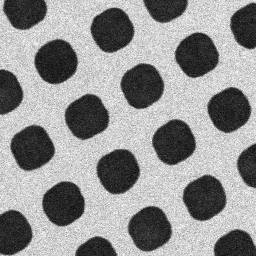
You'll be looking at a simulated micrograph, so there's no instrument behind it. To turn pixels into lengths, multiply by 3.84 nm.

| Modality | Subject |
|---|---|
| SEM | a regular array of holes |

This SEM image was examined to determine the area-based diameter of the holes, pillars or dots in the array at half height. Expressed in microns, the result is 0.166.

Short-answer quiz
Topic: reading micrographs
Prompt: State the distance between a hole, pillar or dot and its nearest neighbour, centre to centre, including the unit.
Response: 242 nm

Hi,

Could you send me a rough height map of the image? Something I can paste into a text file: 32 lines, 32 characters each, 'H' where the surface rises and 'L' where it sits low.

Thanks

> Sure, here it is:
LLLLLLHHHHHHHHHHHHLLLLLHHHHHHHHL
HLLLLLHHHHHHHLLLHHHLLLLHHHHHHLLL
HLLLLHHHHHHHLLLLHHHLLLHHHHHHHLLL
HHLLHHHHHHHLLLLLLHHHHHHHHHHHHLLL
HHHHHHHHHHHHLLLLLHHHHHHHLLHHHLLL
HHHHHHLLLHHHLLLLHHHHHHLLLLLHHHLL
HHHHHLLLLHHHHLHHHHHHHHLLLLLHHHHH
HHHHLLLLLLHHHHHHHHHHHHLLLLLHHHHH
HHHHHLLLLLHHHHHHHLLHHHHLLLLHHHHH
LLHHHLLLLHHHHHHLLLLLHHHHLHHHHHHH
LLHHHHHHHHHHHHHLLLLLHHHHHHHHHHHH
LLLHHHHHHHHHHHHLLLLLHHHHHHHHLLHH
LLLHHHHHHLLLLHHHLLLLHHHHHHLLLLLH
LLHHHHHHLLLLLHHHHLHHHHHHHHLLLLLH
HHHHHHHHLLLLLLHHHHHHHHHHHHLLLLLH
HHHHHHHHLLLLLLHHHHHHHLLHHHHLLLLH
HHLLLLHHHLLLLHHHHHHLLLLLHHHHLHHH
HLLLLLHHHHHHHHHHHHHLLLLLHHHHHHHH
HLLLLLLHHHHHHHHHHHHLLLLLHHHHHHHL
HHLLLLLHHHHHHLLLLHHHLLLLHHHHHHLL
HHLLLLHHHHHHLLLLLHHHHLHHHHHHHHLL
HHHHHHHHHHHHLLLLLHHHHHHHHHHHHHLL
HHHHHHHHHHHHLLLLLHHHHHHHLLLHHHLL
HHHHHHLLLLHHHLLLHHHHHHHLLLLLHHHH
HHHHHLLLLLHHHHHHHHHHHHHLLLLLHHHH
HHHHHLLLLLLHHHHHHHHHHHHLLLLLHHHH
HLHHHHLLLLHHHHHHHLLLHHHHLLLHHHHH
LLLHHHLLLLHHHHHHLLLLLHHHHLHHHHHH
LLLLHHHHHHHHHHHHLLLLLHHHHHHHHHHH
LLLLHHHHHHHHHHHHLLLLLHHHHHHHLLLH
LLLLHHHHHHLLLLHHHLLLLHHHHHHLLLLL
LLHHHHHHHHLLLLHHHHHHHHHHHHHLLLLL